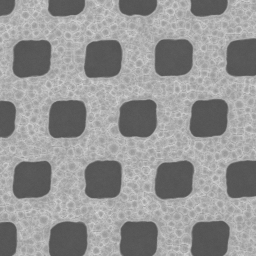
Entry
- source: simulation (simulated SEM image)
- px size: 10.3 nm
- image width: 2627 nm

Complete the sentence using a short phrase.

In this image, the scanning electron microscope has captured a regular array of holes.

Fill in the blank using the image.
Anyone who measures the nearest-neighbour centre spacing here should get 720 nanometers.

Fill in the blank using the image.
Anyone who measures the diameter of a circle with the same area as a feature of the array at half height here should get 40.2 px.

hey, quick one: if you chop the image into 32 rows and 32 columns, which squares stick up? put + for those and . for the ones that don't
..++++.....++++.....++++....++++
.+++++....+++++....+++++....++++
++++++++++++++++++++++++++++++++
++++++++++++++++++++++++++++++++
++++++++++++++++++++++++++++++++
++....+++++....+++++....+++++...
++....+++++....++++.....++++....
++....+++++....++++.....++++....
++....+++++....++++.....++++....
++..+++++++...++++++..+++++++...
++++++++++++++++++++++++++++++++
++++++++++++++++++++++++++++++++
++++++++++++++++++.+++++++..++++
..++++.....++++.....++++.....+++
..++++.....++++.....++++....++++
..++++.....++++.....++++....++++
..++++....+++++....+++++....++++
++++++++++++++++++++++++++++++++
++++++++++++++++++++++++++++++++
++++++++++++++++++++++++++++++++
++....+++++....+++++....+++++...
++....+++++....+++++....++++....
++....+++++....++++.....++++....
++....+++++....++++.....++++....
++...++++++....+++++...++++++...
++++++++++++++++++++++++++++++++
++++++++++++++++++++++++++++++++
++++++++++++++++++++++++++++++++
..+++++....++++.....++++.....+++
..++++.....++++.....++++.....+++
..++++.....++++.....++++.....+++
..++++.....++++....+++++....++++